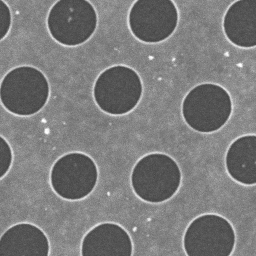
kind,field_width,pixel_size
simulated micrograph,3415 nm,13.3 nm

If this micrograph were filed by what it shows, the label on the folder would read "holes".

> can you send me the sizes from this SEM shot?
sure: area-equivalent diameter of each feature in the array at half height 651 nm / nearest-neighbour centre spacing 1120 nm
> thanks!